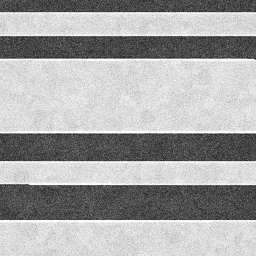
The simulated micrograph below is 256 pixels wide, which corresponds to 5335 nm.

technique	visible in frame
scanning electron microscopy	lines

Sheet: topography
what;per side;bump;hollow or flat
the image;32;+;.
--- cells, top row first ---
................................
................................
++++++++++++++++++++++++++++++++
++++++++++++++++++++++++++++++++
................................
................................
................................
++++++++++++++++++++++++++++++++
++++++++++++++++++++++++++++++++
++++++++++++++++++++++++++++++++
++++++++++++++++++++++++++++++++
++++++++++++++++++++++++++++++++
++++++++++++++++++++++++++++++++
++++++++++++++++++++++++++++++++
++++++++++++++++++++++++++++++++
++++++++++++++++++++++++++++++++
++++++++++++++++++++++++++++++++
................................
................................
................................
++++++++++++++++++++++++++++++++
++++++++++++++++++++++++++++++++
++++++++++++++++++++++++++++++++
................................
................................
................................
................................
................................
++++++++++++++++++++++++++++++++
++++++++++++++++++++++++++++++++
++++++++++++++++++++++++++++++++
++++++++++++++++++++++++++++++++